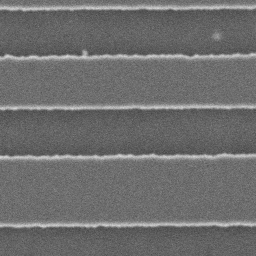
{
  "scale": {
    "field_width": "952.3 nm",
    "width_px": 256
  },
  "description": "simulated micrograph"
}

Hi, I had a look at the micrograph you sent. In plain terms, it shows lines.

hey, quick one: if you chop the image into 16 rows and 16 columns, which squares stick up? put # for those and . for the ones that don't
################
................
................
......##########
################
################
################
................
................
................
################
################
################
################
................
................